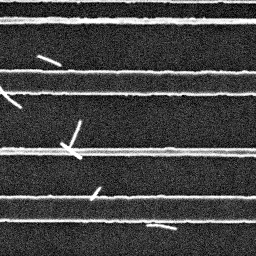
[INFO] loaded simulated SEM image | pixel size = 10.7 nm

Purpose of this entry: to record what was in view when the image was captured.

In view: lines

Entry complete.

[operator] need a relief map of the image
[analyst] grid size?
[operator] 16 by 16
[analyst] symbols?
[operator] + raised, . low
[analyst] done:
................
................
................
................
+++++++++++.++.+
++++++++++++++++
................
................
................
................
................
................
++++++++++++++++
++++++++++++++++
................
................